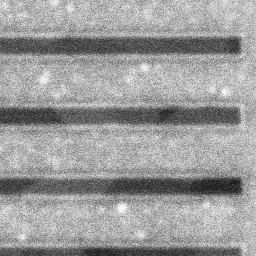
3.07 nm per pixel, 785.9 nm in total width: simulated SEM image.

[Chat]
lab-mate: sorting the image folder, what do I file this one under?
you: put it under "one or a few lines or trenches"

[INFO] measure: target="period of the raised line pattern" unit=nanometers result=214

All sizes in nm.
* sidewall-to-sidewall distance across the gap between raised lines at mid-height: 145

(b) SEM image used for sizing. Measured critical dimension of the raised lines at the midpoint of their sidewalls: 72.2 nm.